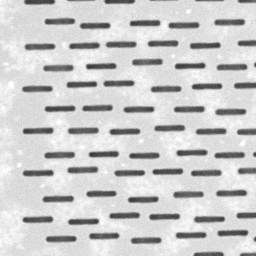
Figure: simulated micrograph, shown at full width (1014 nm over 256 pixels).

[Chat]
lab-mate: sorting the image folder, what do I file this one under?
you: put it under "a regular array of holes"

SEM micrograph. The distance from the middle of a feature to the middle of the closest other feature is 107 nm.